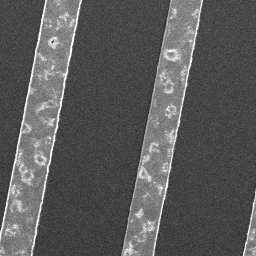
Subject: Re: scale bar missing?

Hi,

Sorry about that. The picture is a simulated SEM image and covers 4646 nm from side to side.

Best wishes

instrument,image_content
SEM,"one or a few lines or trenches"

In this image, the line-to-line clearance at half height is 1610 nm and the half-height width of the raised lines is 579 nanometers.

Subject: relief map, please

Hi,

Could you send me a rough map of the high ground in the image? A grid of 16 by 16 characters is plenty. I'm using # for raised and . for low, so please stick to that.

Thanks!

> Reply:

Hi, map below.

...##......##...
...##.....##....
..###.....##....
..##......##....
..##......##....
..##......##....
..##.....##.....
.###.....##.....
.##......##.....
.##......##.....
.##......##.....
.##.....##......
###.....##......
##......##......
##......##......
##......##.....#